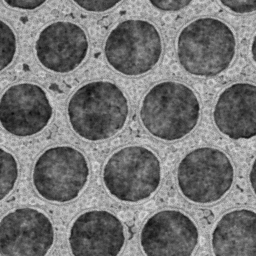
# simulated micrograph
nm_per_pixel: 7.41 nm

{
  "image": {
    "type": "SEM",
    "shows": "a regular array of holes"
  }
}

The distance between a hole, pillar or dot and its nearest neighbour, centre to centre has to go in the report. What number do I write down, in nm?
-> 533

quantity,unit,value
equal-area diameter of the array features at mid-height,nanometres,377